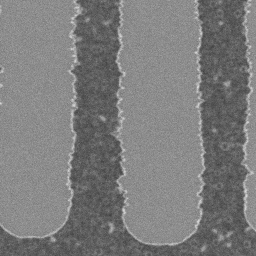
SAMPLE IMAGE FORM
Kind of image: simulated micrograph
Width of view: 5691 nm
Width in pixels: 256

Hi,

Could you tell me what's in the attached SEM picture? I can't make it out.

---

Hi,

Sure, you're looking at one or a few lines or trenches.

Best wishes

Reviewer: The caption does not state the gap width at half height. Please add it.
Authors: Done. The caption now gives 1720 nm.